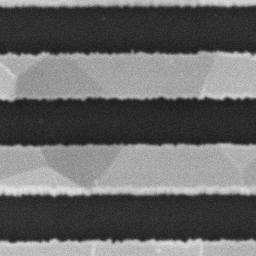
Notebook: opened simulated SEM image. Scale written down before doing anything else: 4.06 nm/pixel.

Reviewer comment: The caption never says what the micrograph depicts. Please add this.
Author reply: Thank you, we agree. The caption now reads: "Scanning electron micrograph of lines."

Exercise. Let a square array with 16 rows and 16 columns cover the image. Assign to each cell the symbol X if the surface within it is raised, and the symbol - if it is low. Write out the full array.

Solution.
----------------
----------------
----------------
XXXXXXXXXXXXXXXX
XXXXXXXXXXXXXXXX
XXXXXXXXXXXXXXXX
----------------
----------------
----------------
XXXXXXXXXXXXXXXX
XXXXXXXXXXXXXXXX
XXXXXXXXXXXXXXXX
----------------
----------------
----------------
XXXXXXXXXXXXXXXX